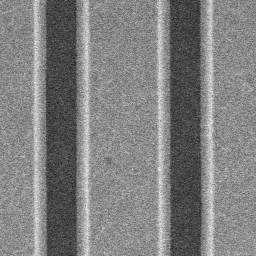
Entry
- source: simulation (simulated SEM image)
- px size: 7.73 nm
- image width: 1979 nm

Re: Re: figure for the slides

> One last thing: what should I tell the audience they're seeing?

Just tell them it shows one or a few lines or trenches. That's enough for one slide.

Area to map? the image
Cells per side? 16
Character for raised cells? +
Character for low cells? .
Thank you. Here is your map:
++...+++++...+++
++...+++++...+++
++...+++++...+++
+++..+++++...+++
+++..+++++...+++
+++..+++++...+++
+++..+++++...+++
+++..+++++...+++
+++..+++++...+++
+++..+++++...+++
+++..+++++...+++
+++..+++++...+++
+++..+++++...+++
+++..+++++...+++
+++..+++++...+++
+++..+++++...+++